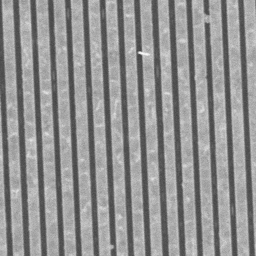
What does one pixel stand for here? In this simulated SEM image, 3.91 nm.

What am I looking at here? parallel lines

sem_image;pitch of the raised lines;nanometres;67.7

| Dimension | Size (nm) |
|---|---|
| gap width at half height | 26.9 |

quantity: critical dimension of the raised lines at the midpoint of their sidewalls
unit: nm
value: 40.6